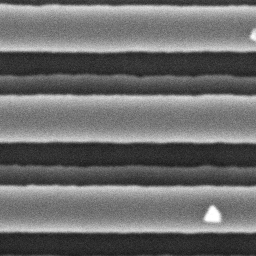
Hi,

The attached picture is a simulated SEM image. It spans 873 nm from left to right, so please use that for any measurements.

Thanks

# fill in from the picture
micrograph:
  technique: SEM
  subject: lines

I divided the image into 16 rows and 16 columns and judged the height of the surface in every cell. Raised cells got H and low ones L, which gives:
HHHHHHHHHHHHHHHH
HHHHHHHHHHHHHHHH
HHHHHHHHHHHHHHHH
LLLLLLLLLLLLLLLL
LLLLLLLLLLLLLLLL
LLLLLLLLLLLLLLLL
HHHHHHHHHHHHHHHH
HHHHHHHHHHHHHHHH
HHHHHHHHHHHHHHHH
LLLLLLLLLLLLLLLL
LLLLLLLLLLLLLLLL
LLLLLLLLLLLLLLLL
HHHHHHHHHHHHHHHH
HHHHHHHHHHHHHHHH
LLLLLLLHLLLHHHHH
LLLLLLLLLLLLLLLL